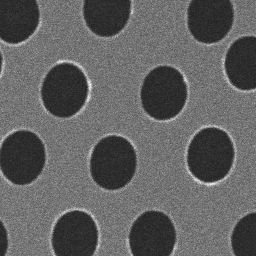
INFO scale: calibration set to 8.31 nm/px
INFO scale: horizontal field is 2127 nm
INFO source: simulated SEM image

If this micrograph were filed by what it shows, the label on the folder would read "holes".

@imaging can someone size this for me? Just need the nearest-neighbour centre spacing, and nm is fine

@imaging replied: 680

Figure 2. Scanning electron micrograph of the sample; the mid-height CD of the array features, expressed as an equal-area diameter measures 0.427 microns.